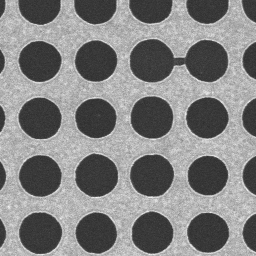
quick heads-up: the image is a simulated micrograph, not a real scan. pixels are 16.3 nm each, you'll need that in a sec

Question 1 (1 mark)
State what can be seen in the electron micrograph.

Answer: a regular array of holes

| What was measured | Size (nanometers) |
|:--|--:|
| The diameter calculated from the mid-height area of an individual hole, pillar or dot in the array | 687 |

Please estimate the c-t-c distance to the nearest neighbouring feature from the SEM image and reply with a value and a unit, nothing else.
908 nm